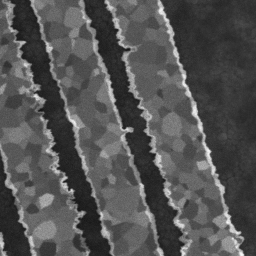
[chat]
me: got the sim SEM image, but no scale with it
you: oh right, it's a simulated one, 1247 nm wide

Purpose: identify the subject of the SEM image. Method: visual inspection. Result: one or a few lines or trenches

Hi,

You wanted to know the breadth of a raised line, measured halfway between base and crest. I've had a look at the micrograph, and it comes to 236 nm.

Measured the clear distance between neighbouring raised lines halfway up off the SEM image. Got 0.12 microns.